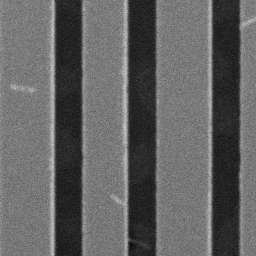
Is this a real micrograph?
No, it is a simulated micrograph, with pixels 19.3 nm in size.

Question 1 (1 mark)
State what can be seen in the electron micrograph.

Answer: lines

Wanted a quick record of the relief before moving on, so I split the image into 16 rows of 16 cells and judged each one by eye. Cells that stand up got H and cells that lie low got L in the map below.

HHHLLHHHLLHHHLLH
HHHLLHHHLLHHHLLH
HHHLLHHHLLHHHLLH
HHHLLHHHLLHHHLLH
HHHLLHHHLLHHHLLH
HHHLLHHHLLHHHLLH
HHHLLHHHLLHHHLLH
HHHLLHHHLLHHHLLH
HHHLLHHHLLHHHLLH
HHHLLHHHLLHHHLLH
HHHLLHHHLLHHHLLH
HHHLLHHHLLHHHLLH
HHHLLHHHLLHHHLLH
HHHLLHHHLLHHHLLH
HHHLLHHHLLHHHLLH
HHHLLHHHLLHHHLLH